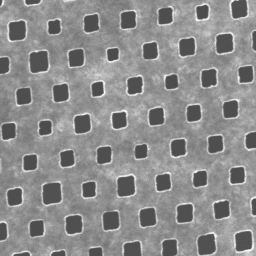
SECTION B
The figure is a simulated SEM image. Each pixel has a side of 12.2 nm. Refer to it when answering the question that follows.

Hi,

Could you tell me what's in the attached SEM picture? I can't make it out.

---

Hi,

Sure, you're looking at a regular array of holes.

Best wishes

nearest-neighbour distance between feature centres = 37.1 px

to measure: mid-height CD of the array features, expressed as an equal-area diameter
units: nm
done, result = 210